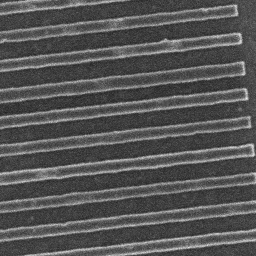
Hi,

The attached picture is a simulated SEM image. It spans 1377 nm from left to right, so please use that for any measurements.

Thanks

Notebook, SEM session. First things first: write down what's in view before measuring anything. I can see parallel lines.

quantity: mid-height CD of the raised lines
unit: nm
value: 56.7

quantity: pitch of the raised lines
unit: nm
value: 151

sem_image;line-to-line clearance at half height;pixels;17.5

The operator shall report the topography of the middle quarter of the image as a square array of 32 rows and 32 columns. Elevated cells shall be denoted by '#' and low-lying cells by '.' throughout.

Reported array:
................................
............................####
...................#############
..........######################
.############################...
#####################...........
############....................
#####...........................
..........................######
..................##############
.........######################.
######################..........
#############...................
#######.........................
................................
...........................#####
................################
..........######################
.######################.........
###############.................
#####.#.........................
................................
............................####
...................#############
..........######################
..#######################.......
###############.................
######..........................
................................
.............................###
....................############
...........#####################